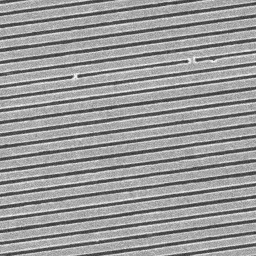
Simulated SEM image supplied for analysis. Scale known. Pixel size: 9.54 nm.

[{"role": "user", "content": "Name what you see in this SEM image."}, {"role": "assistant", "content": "parallel lines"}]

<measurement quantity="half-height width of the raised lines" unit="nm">72.1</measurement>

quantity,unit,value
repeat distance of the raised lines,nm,114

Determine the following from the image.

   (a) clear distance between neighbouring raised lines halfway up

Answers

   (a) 36.6 nanometers